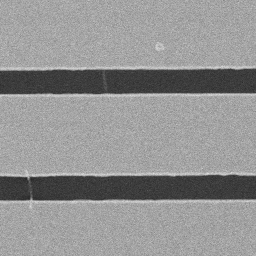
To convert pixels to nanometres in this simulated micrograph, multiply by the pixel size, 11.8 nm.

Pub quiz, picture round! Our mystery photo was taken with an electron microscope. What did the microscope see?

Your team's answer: lines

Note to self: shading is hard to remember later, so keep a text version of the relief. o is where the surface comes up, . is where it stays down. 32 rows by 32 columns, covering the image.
oooooooooooooooooooooooooooooooo
oooooooooooooooooooooooooooooooo
oooooooooooooooooooooooooooooooo
oooooooooooooooooooooooooooooooo
oooooooooooooooooooooooooooooooo
oooooooooooooooooooooooooooooooo
oooooooooooooooooooooooooooooooo
oooooooooooooooooooooooooooooooo
oooooooooooooooooooooooooooooooo
................................
................................
................................
oooooooooooooooooooooooooooooooo
oooooooooooooooooooooooooooooooo
oooooooooooooooooooooooooooooooo
oooooooooooooooooooooooooooooooo
oooooooooooooooooooooooooooooooo
oooooooooooooooooooooooooooooooo
oooooooooooooooooooooooooooooooo
oooooooooooooooooooooooooooooooo
oooooooooooooooooooooooooooooooo
oooooooooooooooooooooooooooooooo
................................
................................
................................
oooooooooooooooooooooooooooooooo
oooooooooooooooooooooooooooooooo
oooooooooooooooooooooooooooooooo
oooooooooooooooooooooooooooooooo
oooooooooooooooooooooooooooooooo
oooooooooooooooooooooooooooooooo
oooooooooooooooooooooooooooooooo